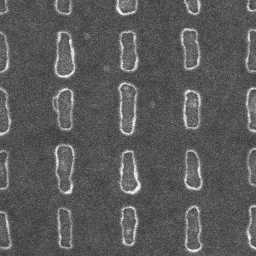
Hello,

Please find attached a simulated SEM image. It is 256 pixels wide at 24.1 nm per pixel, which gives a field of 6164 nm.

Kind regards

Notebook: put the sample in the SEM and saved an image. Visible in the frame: a regular array of holes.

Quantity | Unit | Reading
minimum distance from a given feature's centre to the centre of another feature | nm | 1380